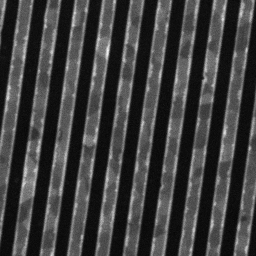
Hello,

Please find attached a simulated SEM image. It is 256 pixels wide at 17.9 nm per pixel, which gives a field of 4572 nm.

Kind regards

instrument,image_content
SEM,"parallel lines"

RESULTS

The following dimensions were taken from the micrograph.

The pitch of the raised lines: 490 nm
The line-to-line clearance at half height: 270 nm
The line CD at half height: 223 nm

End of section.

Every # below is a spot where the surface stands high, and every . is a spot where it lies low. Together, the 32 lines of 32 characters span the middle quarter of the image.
.###....###....##....###....###.
.###....##.....##....###....###.
###....###....###....###....###.
###....###....###....###....###.
###....###....###....###....###.
###....###....###....###....###.
###....###....###....###....###.
###....###....###....###...###..
###...###....###....###....###..
###...###....###....###....###..
##....###....###....###....###..
##....###....###....###....###..
##....###....###....###....###..
##....###....###....###....###..
##....###....###....###....###..
#....###....###....###....###...
#....###....###....###....###...
#....###....###....###....###...
#....###....###....###....###...
#....###....###....###....###...
#....###....###....###....##....
#....###....###....###....##....
....###....###....###....###....
....###....###....###....###....
....###....###....###....###....
....###....###....###....###....
....###....###....###....###....
....###....###....###....##.....
....###....###....###....##.....
....###....##....###....###....#
...###.....##....###.....##....#
...###....###....###....###....#